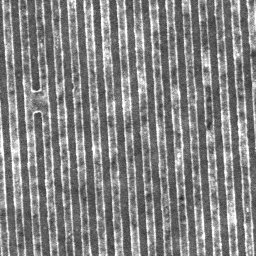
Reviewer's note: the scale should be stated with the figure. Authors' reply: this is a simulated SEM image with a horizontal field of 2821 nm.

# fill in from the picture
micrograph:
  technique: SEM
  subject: parallel lines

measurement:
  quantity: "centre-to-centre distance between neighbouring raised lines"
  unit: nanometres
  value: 180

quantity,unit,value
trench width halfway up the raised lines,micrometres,0.0907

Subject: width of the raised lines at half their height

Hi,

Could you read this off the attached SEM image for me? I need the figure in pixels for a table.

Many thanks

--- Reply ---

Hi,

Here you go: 7.36